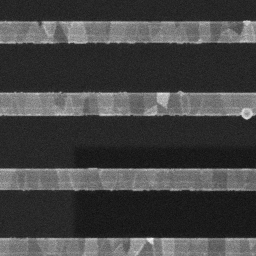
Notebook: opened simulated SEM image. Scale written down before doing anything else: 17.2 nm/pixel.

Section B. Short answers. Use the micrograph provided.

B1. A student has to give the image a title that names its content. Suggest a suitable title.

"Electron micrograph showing lines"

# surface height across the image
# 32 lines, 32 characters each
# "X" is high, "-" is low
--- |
--------------------------------
--------------------------------
--------------------------------
XXXXXXXXXXXXXXXXXXXXXXXXXXXXXXXX
XXXXXXXXXXXXXXXXXXXXXXXXXXXXXXXX
--------------------------------
--------------------------------
--------------------------------
--------------------------------
--------------------------------
--------------------------------
--------------------------------
XXXXXXXXXXXXXXXXXXXXXXXXXXXXXXXX
XXXXXXXXXXXXXXXXXXXXXXXXXXXXXXXX
------------------------------XX
--------------------------------
--------------------------------
--------------------------------
--------------------------------
--------------------------------
--------------------------------
XXXXXXXXXXXXXXXXXXXXXXXXXXXXXXXX
XXXXXXXXXXXXXXXXXXXXXXXXXXXXXXXX
XXXXXXXXXXXXXXXXXXXXXXXXXXXXXXXX
--------------------------------
--------------------------------
--------------------------------
--------------------------------
--------------------------------
--------------------------------
XXXXXXXXXXXXXXXXXXXXXXXXXXXXXXXX
XXXXXXXXXXXXXXXXXXXXXXXXXXXXXXXX